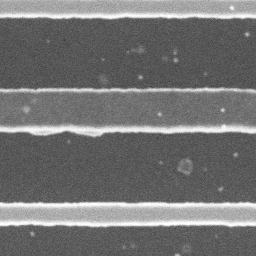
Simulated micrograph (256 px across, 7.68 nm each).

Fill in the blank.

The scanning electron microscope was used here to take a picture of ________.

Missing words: lines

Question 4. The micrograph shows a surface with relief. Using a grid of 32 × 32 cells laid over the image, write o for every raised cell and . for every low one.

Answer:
oooooooooooooooooooooooooooooooo
oooooooooooooooooooooooooooooooo
................................
................................
................................
................................
................................
................................
................................
................................
................................
oooooooooooooooooooooooooooooooo
oooooooooooooooooooooooooooooooo
oooooooooooooooooooooooooooooooo
oooooooooooooooooooooooooooooooo
oooooooooooooooooooooooooooooooo
................................
................................
................................
................................
................................
................................
................................
................................
................................
ooo.oo..o.oooooo.oooo..ooo..o.oo
oooooooooooooooooooooooooooooooo
oooooooooooooooooooooooooooooooo
................................
................................
................................
................................